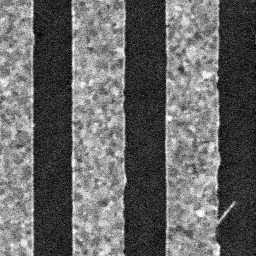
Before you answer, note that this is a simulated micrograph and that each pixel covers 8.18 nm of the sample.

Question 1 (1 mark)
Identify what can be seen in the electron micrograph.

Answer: one or a few lines or trenches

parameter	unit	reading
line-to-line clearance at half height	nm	338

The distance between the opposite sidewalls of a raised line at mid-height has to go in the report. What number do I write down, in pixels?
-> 50.4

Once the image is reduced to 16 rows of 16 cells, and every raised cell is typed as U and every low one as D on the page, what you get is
UUDDDUUUDDUUUUDD
UUDDDUUUDDUUUUDD
UUDDDUUUDDUUUUDD
UUDDDUUUDDUUUUDD
UUDDDUUUDDUUUUDD
UUDDDUUUDDUUUUDD
UUDDDUUUDDUUUUDD
UUDDDUUUDDUUUUDD
UUDDDUUUDDUUUUDD
UUDDDUUUDDUUUUDD
UUDDDUUUDDUUUUDD
UUDDDUUUDDUUUUDD
UUDDDUUUDDUUUUDD
UUDDDUUUDDUUUUDD
UUDDDUUUDDUUUDDD
UUDDDUUUDDUUUUDD